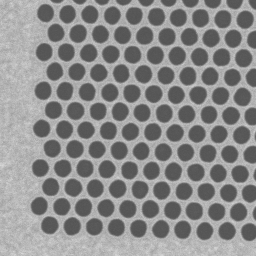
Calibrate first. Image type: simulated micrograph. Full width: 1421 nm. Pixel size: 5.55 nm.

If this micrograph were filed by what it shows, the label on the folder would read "a regular array of holes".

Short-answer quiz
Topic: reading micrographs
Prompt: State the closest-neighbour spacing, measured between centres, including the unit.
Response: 121 nanometres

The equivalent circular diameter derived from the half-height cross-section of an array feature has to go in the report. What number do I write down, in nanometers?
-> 98.9